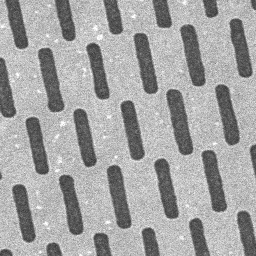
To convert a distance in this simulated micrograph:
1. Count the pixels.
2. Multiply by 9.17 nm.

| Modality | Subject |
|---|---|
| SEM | a regular array of holes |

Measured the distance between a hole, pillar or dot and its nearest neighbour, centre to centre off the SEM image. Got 0.442 µm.